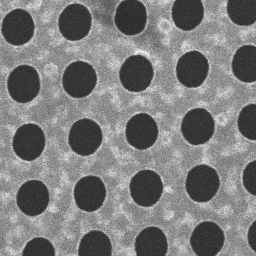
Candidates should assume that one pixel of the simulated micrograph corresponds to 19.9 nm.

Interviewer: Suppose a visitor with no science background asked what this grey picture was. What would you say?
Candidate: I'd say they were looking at a regular array of holes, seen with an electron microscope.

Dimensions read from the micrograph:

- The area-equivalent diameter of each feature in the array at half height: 709 nm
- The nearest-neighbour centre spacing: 1120 nm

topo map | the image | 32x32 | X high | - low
XXXXXXXXX-XXXXX---XXXX---XXX----
X--XXXXX---XXX----XXX----XXX----
----XXX----XXX----XXXX---XXXX---
----XXX----XXXX---XXXX--XXXXXXXX
----XXXX---XXXXXXXXXXXXXXXXXXXXX
X--XXXXXXXXXXXXXXXXXXXXXXXXXXXXX
XXXXXXXXXXXXXXXXXXXXXXX--XXXX---
XXXXXXXXXXXXXXXX---XXX----XXX---
XX--XXXX----XXX----XXX----XXX---
X----XXX----XXX----XXX----XXX---
X----XXX----XXX----XXXX--XXXXXXX
X----XXX---XXXXXXXXXXXXXXXXXXXXX
XX--XXXXXXXXXXXXXXXXXXXXXXXXXXXX
XXXXXXXXXXXXXXXXXXXXXXXXXXXXXX--
XXXXXXXXXXXXXXXXX--XXXX---XXXX--
XXX-XXXXX---XXXX----XXX----XXX--
XX---XXXX----XXX----XXX----XXX--
XX----XX-----XXX----XXX---XXXXX-
XX----XXX---XXXXX--XXXXXXXXXXXXX
XX---XXXXX-XXXXXXXXXXXXXXXXXXXXX
XXXXXXXXXXXXXXXXXXXXXXXXXXXXXXX-
XXXXXXXXXXXXXXXXX--XXXXX---XXX--
XXXXXXXXXX---XXX----XXX----XXX--
XX----XXX----XXX----XXX----XXXX-
XX----XXX----XXX----XXXX---XXXXX
XX----XXX----XXXX--XXXXXXXXXXXXX
XXX--XXXXXXXXXXXXXXXXXXXXXXXXXXX
XXXXXXXXXXXXXXXXXXXXXXXXXXXXXXXX
XXXXXXXXXXXXXXXXXX--XXXX----XXX-
XXXXXXXXXX---XXXX----XXX----XXX-
XXX---XXXX----XXX----XXX----XXX-
XXX----XXX----XXX----XXX---XXXXX